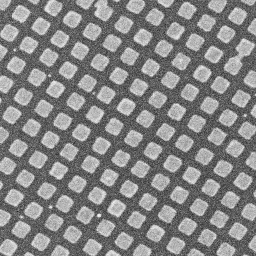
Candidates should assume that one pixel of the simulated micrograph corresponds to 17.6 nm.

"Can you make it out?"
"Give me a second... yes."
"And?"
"a regular array of raised bodies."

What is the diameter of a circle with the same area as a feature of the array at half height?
264 nm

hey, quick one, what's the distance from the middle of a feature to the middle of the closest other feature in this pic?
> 391 nm